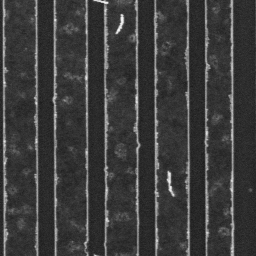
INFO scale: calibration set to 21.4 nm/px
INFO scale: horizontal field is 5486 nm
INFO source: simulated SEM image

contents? parallel lines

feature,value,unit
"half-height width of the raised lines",691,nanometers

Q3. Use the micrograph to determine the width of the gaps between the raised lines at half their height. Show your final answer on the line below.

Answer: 383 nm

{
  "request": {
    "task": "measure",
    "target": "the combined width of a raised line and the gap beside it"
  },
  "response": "1.06 micrometres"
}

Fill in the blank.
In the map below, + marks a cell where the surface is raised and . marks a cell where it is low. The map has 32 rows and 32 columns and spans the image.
+++++..++++..++++...+++...+++...
+++++..++++..++++..++++...+++...
+++++..++++..++++..++++...+++...
.++++..++++..++++..++++...+++...
.++++..++++..++++..++++...+++...
.++++..++++..++++..++++...+++...
.++++..++++..++++..++++...+++...
.++++..++++..++++..++++...+++...
.++++..++++..++++..++++...+++...
.++++..++++..++++..++++...+++...
.++++..++++..++++..++++...+++...
.++++..++++..++++..++++...+++...
.++++..++++..++++..++++...+++...
.++++..++++..++++..++++...+++...
.++++..++++..++++..++++...+++...
.++++..++++..++++..++++...+++...
.++++..++++..++++..++++...+++...
.++++..++++..++++..++++...+++...
.++++..++++..++++..++++...+++...
.++++..++++..++++..++++...+++...
.++++..++++..++++..++++...+++...
.++++..++++..++++..++++...+++...
.++++..++++..++++..++++...+++...
.++++..++++..++++..+++++..+++...
.++++..++++..++++..+++++..+++...
.++++..++++..++++...++++..+++...
.++++..++++..++++...++++..+++...
.++++..++++..++++...++++..+++...
.++++..++++..++++...++++..+++...
.++++..++++..++++...++++..+++...
.++++..++++..++++...++++..+++...
.++++..++++..++++...++++..+++...